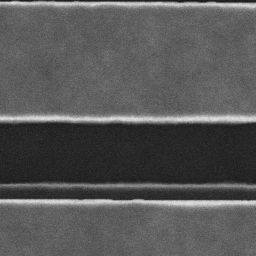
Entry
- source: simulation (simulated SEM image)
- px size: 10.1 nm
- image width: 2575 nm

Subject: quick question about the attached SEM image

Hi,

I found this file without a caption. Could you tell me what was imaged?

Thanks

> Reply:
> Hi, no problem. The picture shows lines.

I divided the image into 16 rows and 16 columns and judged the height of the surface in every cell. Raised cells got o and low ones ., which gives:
oooooooooooooooo
oooooooooooooooo
oooooooooooooooo
oooooooooooooooo
oooooooooooooooo
oooooooooooooooo
oooooooooooooooo
....oooooooooooo
................
................
................
................
ooooooo.o.......
oooooooooooooooo
oooooooooooooooo
oooooooooooooooo